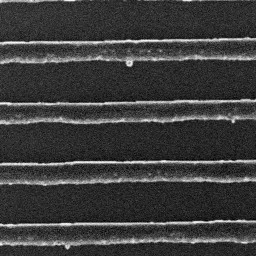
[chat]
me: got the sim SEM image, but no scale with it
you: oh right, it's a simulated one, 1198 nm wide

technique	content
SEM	lines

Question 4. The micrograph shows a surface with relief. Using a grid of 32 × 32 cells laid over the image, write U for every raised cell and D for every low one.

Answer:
DDDDDDDDDDDDDDDDDDDDDDDDDDDDDDDD
DDDDDDDDDDDDDDDDDDDDDDDDDDDDDDDD
DDDDDDDDDDDDDDDDDDDDDDDDDDDDDDDD
DDDDDDDDDDDDDDDDDDDDDDDDDDDDDDDD
DDDDDDDDDDDDDDDDDDDDDDDDDDDDDDDD
UUUUUUUUUUUUUUUUUUUUUUUUUUUUUUUU
UUUUUUUUUUUUUUUUUUUUUUUUUUUUUUUU
UUUUUUUUDDDDDDDDDDDDDDDDDDDDDDDD
DDDDDDDDDDDDDDDDDDDDDDDDDDDDDDDD
DDDDDDDDDDDDDDDDDDDDDDDDDDDDDDDD
DDDDDDDDDDDDDDDDDDDDDDDDDDDDDDDD
DDDDDDDDDDDDDDDDDDDDDDDDDDDDDDDD
DDDDDDDDDDDDDDDDDDDDDDDDDDDDDDDD
UUUUUUUUUUUUUUUUUUUUUUUUUUUUUUUU
UUUUUUUUUUUUUUUUUUUUUUUUUUUUUUUU
DDDDDDDDDDDDDDDDDDDDDDDDDDDDDDDD
DDDDDDDDDDDDDDDDDDDDDDDDDDDDDDDD
DDDDDDDDDDDDDDDDDDDDDDDDDDDDDDDD
DDDDDDDDDDDDDDDDDDDDDDDDDDDDDDDD
DDDDDDDDDDDDDDDDDDDDDDDDDDDDDDDD
DDDUUDUUUUUUUUUUUUUUUUUUUUUUUUUU
UUUUUUUUUUUUUUUUUUUUUUUUUUUUUUUU
UUUUUUUUUUUUUUUDDDDDDDDDUDUUUUUD
DDDDDDDDDDDDDDDDDDDDDDDDDDDDDDDD
DDDDDDDDDDDDDDDDDDDDDDDDDDDDDDDD
DDDDDDDDDDDDDDDDDDDDDDDDDDDDDDDD
DDDDDDDDDDDDDDDDDDDDDDDDDDDDDDDD
DDDDDDDDDDDDDDDDDDDDDDDDDDDDDDDD
UUUUUUUUUUUUUUUUUUUUUUUUUUUUUUUU
UUUUUUUUUUUUUUUUUUUUUUUUUUUUUUUU
DDDDDDDDDDDDDDDDDDDDDDDDDDDDDDDD
DDDDDDDDDDDDDDDDDDDDDDDDDDDDDDDD